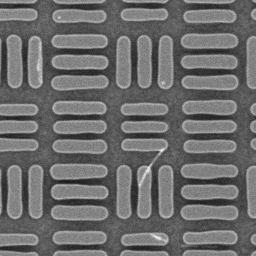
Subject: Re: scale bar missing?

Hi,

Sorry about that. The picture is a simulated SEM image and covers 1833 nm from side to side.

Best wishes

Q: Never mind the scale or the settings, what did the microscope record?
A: groups of lines, slits or small figures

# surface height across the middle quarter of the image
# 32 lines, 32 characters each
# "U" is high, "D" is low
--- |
UUUUUUUUUUUDDUUUUDDUUUDDUUUDDDUU
DDDDDDDDDDDDDUUUUDDUUUDDUUUDDDDD
DDDDDDDDDDDDDUUUUDDUUUDDUUUDDDDD
UUUUUUUUUUUDDUUUUDDUUUDDUUUDDDUU
UUUUUUUUUUUDDUUUUDDUUUDDUUUDDUUU
UUUUUUUUUUUDDDUUDDDUUDDDUUUDDDUU
DDDDDDDDDDDDDDDDDDDDDDDDDDDDDDDD
DDDDDDDDDDDDDDDDDDDDDDDDDDDDDDDD
DDDDDDDDDDDDDDDDDDDDDDDDDDDDDDDD
UUUUDDDDDDDDDDDDDDDDDDDDDDDDDDDU
UUUUUUUUUUDDDDDUUUUUUUUUUUDDDDUU
UUUUUUUUUUDDDDUUUUUUUUUUUUDDDDUU
DDDDDDDDDDDDDDDUUUUUUUUUUDDDDDDD
DDDDDDDDDDDDDDDDDDDDDDDDDDDDDDDD
UUUUUUUUUUDDDDDUUUUUUUUUDDDDDDUU
UUUUUUUUUUDDDDDUUUUUUUUUUUDDDDUU
UUUUUUUUUUDDDDDUUUUUUUUUUUDDDDUU
DDDDDDDDDDDDDDDDDDDDDDDDDDDDDDDD
DDDDDDDDDDDDDDDDDDDDDDDDDDDDDDDD
UUUUUUUUUUDDDDDUUUUUUUUUUUDDDDDU
UUUUUUUUUUUDDDDUUUUUUUUUUUDDDDUU
UUUUUUUUUUUDDDDUUUUUUUUUUDDDDDUU
DDDDDDDDDDDDDDDDDDDDDDDDDDDDDDDD
DDDDDDDDDDDDDDDDDDDDDDDDDDDDDDDD
DDDDDDDDDDDDDDDDDDDDDDDDDDDDDDDD
UUUUUUUUUUDDDDUUDDDDDDDDDUDDDDUU
UUUUUUUUUUUDDUUUUDDUUUDDUUUDDUUU
UUUUUUUUUUUDDUUUUDDUUUDDUUUDDUUU
UUUUDDDDDDDDDUUUUDDUUUDDUUUDDDDD
DDDDDDDDDDDDDUUUUDDUUUDDUUUDDDDD
UUUUUUUDDDDDDUUUUDDUUUDDUUUDDDUU
UUUUUUUUUUUDDUUUUDDUUUDDUUUDDUUU